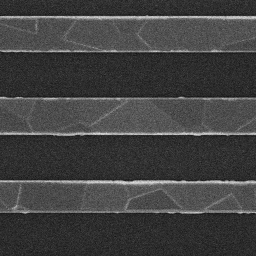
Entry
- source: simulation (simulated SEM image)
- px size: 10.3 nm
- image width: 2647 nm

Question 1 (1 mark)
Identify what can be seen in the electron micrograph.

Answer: lines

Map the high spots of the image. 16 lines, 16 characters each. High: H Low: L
LLLLLLLLLLLLLLLL
HHHHHHHHHHHHHHHH
HHHHHHHHHHHHHHHH
LLLLLLLLLLLLLLLL
LLLLLLLLLLLLLLLL
LLLLLLLLLLLLLLLL
HHHHHHHHHHHHHHHH
HHHHHHHHHHHHHHHH
LLLLLLLLLLLLLLLL
LLLLLLLLLLLLLLLL
LLLLLLLLLLLLLLLL
HHHHHHHHHHHHHHHH
HHHHHHHHHHHHHHHH
LLLLLLLLLLLLLLLL
LLLLLLLLLLLLLLLL
LLLLLLLLLLLLLLLL